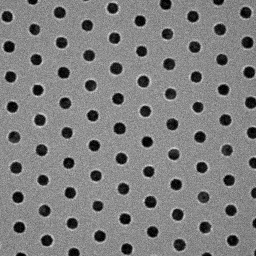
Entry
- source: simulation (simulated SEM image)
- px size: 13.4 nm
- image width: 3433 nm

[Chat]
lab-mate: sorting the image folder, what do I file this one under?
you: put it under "a regular array of holes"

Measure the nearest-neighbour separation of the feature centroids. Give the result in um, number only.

0.402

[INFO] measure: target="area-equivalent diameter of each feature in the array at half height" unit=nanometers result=170